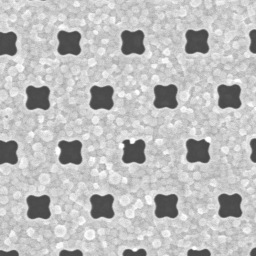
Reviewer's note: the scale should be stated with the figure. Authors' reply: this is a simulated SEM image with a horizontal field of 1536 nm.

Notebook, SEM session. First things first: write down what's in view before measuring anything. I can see a regular array of holes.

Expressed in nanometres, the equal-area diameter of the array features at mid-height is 153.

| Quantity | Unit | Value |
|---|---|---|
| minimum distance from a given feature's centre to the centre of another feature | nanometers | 378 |